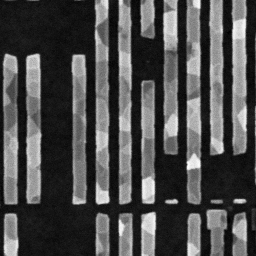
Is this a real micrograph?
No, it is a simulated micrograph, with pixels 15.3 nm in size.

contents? wiring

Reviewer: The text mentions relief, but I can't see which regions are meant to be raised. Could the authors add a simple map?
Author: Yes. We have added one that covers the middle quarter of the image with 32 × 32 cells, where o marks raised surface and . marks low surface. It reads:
..ooo...ooo...ooo........ooo...o
..ooo...ooo...ooo........ooo...o
..ooo...ooo...ooo........ooo...o
..ooo...ooo...ooo........ooo...o
...oo...ooo...ooo...oo...ooo...o
...oo...ooo...ooo...oo...ooo...o
...oo...ooo...ooo...oo...ooo...o
...oo...ooo...ooo...oo...ooo...o
...oo...ooo...ooo...oo...ooo...o
...oo...ooo...ooo...oo...ooo...o
...oo...ooo...ooo...oo...ooo...o
...oo...ooo...ooo...oo...ooo...o
...oo...ooo...ooo...oo...ooo...o
...oo...ooo...ooo...oo...ooo...o
...oo...ooo...ooo..ooo...ooo...o
...oo...ooo...ooo...oo...ooo...o
...oo...ooo...ooo...oo...ooo...o
...oo...ooo...ooo...oo...ooo...o
...oo...ooo...ooo...oo...ooo...o
..ooo...ooo...ooo...oo...ooo...o
..ooo...ooo...ooo...oo...ooo...o
...oo...ooo...ooo...oo...ooo...o
...oo...ooo...ooo...ooo........o
...oo...ooo...ooo...ooo........o
...oo...ooo...ooo...oo.........o
...oo...ooo...ooo...oo.........o
...oo...ooo...ooo...oo.........o
...oo...ooo...ooo...oo.........o
...oo...ooo...ooo...oo.........o
...oo...ooo...ooo...oo.........o
...oo...ooo...ooo...oo.........o
...oo...ooo...ooo...oo.........o